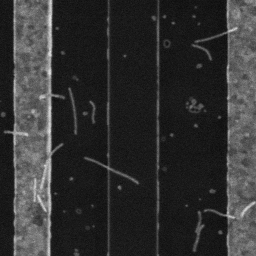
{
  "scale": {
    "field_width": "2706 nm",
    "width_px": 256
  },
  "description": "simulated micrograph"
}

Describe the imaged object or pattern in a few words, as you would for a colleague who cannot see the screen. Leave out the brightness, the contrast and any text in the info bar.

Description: lines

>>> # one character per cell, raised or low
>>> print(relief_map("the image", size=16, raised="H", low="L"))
LHHLLLLHHHLLLLHH
LHHLLLLHHHLLLLHH
LHHLLLLHHHLLLLHH
LHHLLLLHHHLLLLHH
LHHLLLLHHHLLLLHH
LHHLLLLHHHLLLLHH
LHHLLLLHHHLLLLHH
LHHLLLLHHHLLLLHH
LHHLLLLHHHLLLLHH
LHHLLLLHHHLLLLHH
LHHLLLLHHHLLLLHH
LHHLLLLHHHLLLLHH
LHHLLLLHHHLLLLHH
LHHLLLLHHHLLLLHH
LHHLLLLHHHLLLLHH
LHHLLLLHHHLLLLHH